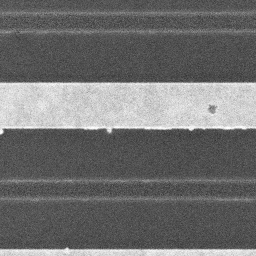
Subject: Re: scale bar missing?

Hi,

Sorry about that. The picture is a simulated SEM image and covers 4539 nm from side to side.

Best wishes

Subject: lines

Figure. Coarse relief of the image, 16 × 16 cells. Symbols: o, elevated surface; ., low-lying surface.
................
................
................
................
................
oooooooooooooooo
oooooooooooooooo
oooooooooooooooo
................
................
................
................
................
................
................
................